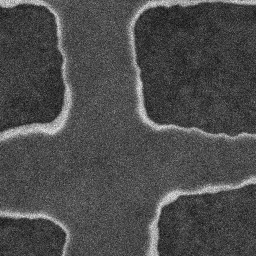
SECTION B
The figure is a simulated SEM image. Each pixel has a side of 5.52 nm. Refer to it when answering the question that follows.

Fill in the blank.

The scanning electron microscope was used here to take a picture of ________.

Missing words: holes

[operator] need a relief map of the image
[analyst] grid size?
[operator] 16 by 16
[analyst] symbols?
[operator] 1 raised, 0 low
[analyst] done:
0001111110000000
0000111100000000
0000111100000000
0000111100000000
0000111110000000
0000111110000000
0000111110000000
0000111110000000
1111111111111111
1111111111111111
1111111111111111
1111111111111110
1111111111100000
1111111111000000
0000111111000000
0000111111000000